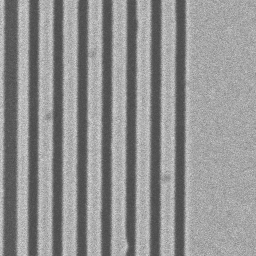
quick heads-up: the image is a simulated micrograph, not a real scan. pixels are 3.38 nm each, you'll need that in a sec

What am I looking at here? parallel lines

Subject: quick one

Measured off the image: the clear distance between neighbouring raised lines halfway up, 31.6 nanometres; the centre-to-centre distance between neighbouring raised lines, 81.5 nanometers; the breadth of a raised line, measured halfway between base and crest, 53.6 nanometers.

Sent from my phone